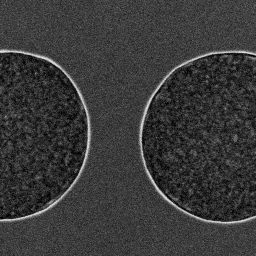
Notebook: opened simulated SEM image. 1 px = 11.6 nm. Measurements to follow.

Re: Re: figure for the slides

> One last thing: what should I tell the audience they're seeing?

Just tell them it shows holes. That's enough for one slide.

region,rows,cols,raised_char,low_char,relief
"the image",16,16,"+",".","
++++++++++++++++
++++++++++++++++
++++++++++++++++
..+++++++++++...
....+++++++.....
.....+++++......
.....++++.......
.....++++.......
......+++.......
.....++++.......
.....++++.......
.....+++++......
....+++++++.....
..++++++++++....
++++++++++++++++
++++++++++++++++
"